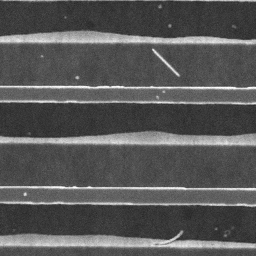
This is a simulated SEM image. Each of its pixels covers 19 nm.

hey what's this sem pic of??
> lines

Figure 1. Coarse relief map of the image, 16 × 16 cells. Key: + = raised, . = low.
................
................
++++++++........
++++++++++++++++
++++++++++++++++
++++++++++++++++
................
................
................
++++++++++++++++
++++++++++++++++
++++++++++++++++
++++++++++++++++
................
................
++++++++++++++++